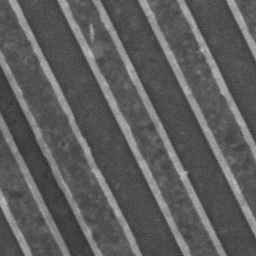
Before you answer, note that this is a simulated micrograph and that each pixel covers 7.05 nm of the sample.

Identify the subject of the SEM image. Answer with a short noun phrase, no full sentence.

one or a few lines or trenches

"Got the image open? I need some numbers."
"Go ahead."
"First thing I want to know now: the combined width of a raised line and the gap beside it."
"0.525 micrometres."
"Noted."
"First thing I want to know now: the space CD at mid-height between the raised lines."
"284 nanometers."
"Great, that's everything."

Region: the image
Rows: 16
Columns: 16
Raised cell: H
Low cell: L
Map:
HLLLHHLLLHHHLLLH
HHLLLHHLLLHHLLLH
HHLLLHHLLLHHHLLL
HHHLLLHHLLLHHLLL
HHHLLLHHLLLHHHLL
LHHHLLLHHLLLHHLL
LHHHLLLHHLLLHHHL
LLHHLLLLHHLLLHHL
LLHHHLLLHHLLLHHH
HLLHHLLLLHHLLLHH
HLLHHHLLLHHLLLHH
HHLLHHLLLLHHLLLH
HHLLHHHLLLHHLLLH
LHHLLHHHLLLHHLLL
LHHLLHHHLLLHHLLL
LLHHLLHHLLLLHHLL